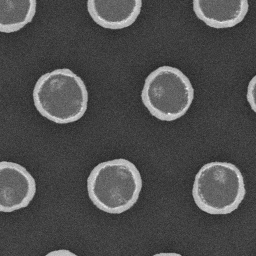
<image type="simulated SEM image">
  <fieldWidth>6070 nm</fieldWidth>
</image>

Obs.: raised bodies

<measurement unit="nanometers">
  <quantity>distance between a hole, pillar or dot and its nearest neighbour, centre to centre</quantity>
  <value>2460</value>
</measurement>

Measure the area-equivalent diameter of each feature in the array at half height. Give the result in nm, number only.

1160